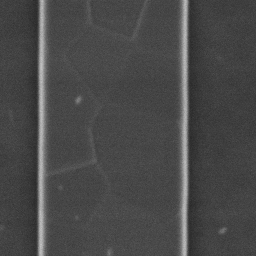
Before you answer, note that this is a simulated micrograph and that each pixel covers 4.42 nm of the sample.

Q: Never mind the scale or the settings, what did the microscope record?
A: wiring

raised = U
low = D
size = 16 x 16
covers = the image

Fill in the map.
DDDUUUUUUUUUDDDD
DDDUUUUUUUUUDDDD
DDDUUUUUUUUUDDDD
DDDUUUUUUUUUDDDD
DDDUUUUUUUUUDDDD
DDDUUUUUUUUUDDDD
DDDUUUUUUUUUDDDD
DDDUUUUUUUUUDDDD
DDDUUUUUUUUUDDDD
DDDUUUUUUUUUDDDD
DDDUUUUUUUUUDDDD
DDDUUUUUUUUUDDDD
DDDUUUUUUUUUDDDD
DDDUUUUUUUUUDDDD
DDDUUUUUUUUUDDDD
DDDUUUUUUUUUDDDD